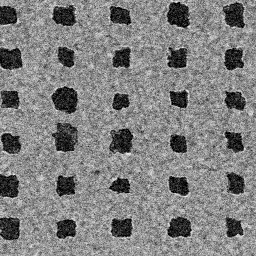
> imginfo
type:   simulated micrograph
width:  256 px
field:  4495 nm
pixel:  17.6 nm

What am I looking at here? a regular array of holes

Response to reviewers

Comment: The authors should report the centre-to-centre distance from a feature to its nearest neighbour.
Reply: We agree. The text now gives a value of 731 nm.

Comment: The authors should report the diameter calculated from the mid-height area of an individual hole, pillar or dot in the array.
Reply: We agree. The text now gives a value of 362 nm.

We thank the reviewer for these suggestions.